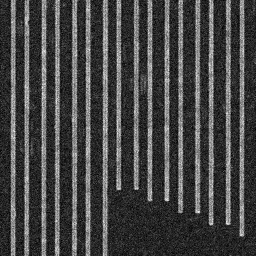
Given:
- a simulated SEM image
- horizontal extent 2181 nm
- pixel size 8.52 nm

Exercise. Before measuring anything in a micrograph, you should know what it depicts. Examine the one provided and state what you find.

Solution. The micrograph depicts parallel lines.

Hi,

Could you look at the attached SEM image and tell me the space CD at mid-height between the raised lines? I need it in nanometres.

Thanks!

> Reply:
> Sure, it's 91.6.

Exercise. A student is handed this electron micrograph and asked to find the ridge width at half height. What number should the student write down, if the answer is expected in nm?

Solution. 33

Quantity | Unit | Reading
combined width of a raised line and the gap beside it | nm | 130